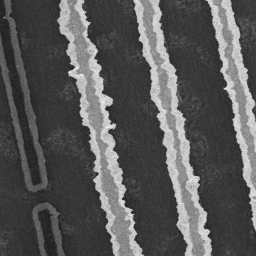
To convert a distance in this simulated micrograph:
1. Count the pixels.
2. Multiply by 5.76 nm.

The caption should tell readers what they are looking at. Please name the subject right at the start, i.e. one or a few lines or trenches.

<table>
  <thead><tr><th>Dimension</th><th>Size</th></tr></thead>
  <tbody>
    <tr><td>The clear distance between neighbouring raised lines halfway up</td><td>54.1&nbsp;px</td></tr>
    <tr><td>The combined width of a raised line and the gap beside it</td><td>0.416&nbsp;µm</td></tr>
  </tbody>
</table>